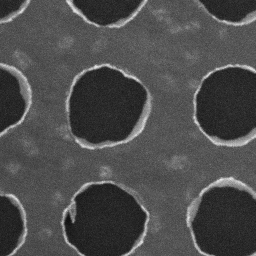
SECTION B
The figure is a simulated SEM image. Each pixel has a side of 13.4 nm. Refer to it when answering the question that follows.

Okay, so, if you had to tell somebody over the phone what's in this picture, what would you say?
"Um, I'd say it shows holes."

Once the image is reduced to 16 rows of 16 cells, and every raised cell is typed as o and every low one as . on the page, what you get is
.oooo....oooo...
oooooo.ooooooooo
oooooooooooooooo
oooooooooooooooo
.oooo..oooooo...
..ooo....oooo...
..oo.....ooo....
.ooo.....ooo....
ooooo...ooooo...
oooooooooooooooo
oooooooooooooooo
oooooo.ooooooooo
.oooo...oooo....
.ooo.....ooo....
..oo.....ooo....
.oooo...ooooo...